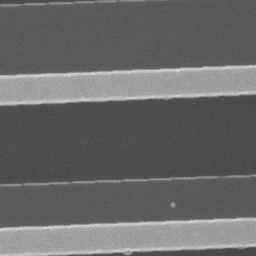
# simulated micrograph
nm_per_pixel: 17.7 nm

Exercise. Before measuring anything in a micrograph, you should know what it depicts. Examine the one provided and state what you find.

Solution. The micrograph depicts lines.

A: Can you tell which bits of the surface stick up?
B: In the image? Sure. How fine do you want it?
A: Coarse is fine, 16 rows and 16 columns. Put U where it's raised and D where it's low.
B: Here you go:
UUUUUUUUUUUUUUUU
UUUUUUUUUUUUUUUU
UUUUUUUUUUUUUUUU
UUUUUUUUUUUUUUUU
UUUUUUUUUUUUUUUU
UUUUUUUUUUUUUUUU
UDDDDDDDDDDDDDDD
DDDDDDDDDDDDDDDD
DDDDDDDDDDDDDDDD
DDDDDDDDDDDDDDDD
DDDDDDDDDDDDDDDD
DDUUUUUUUUUUUUUU
UUUUUUUUUUUUUUUU
UUUUUUUUUUUUUUUU
UUUUUUUUUUUUUUUU
UUUUUUUUUUUUUUUD